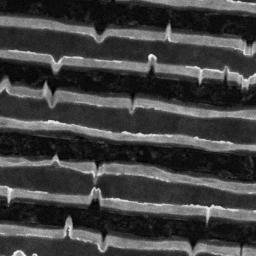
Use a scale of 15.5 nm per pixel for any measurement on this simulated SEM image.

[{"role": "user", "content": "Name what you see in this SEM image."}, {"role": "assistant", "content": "one or a few lines or trenches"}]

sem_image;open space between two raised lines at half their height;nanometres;549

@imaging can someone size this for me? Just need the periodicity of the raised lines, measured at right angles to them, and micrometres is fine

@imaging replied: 1.07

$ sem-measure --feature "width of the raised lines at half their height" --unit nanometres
522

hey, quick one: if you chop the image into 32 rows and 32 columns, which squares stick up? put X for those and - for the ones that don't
--------------------------XXXXXX
--------------------------------
--------------------------------
XXXXXXXXX-----------------------
XXXXXXXXXXXX-XXXXXXXXX----------
XXXXXXXXXXXXXXXXXXXXXXXXXXXXXX--
XXXXXXXXXXXXXXXXXXXXXXXXXXXXXXXX
------XXXXXXXXXXXXXXXXXXXXXXXXXX
--------------------XXXXXXXXXXXX
-----------------------------XXX
--------------------------------
XXXXXX--------------------------
XXXXXXXXXXXX--------------------
XXXXXXXXXXXXXXXXXXXXX-----------
XXXXXXXXXXXXXXXXXXXXXXXXXXXXXXXX
--XXXXXXXXXXXXXXXXXXXXXXXXXXXXXX
-----------XXXXXXXXXXXXXXXXXXXXX
-----------------------XXXXXXXXX
---------------------------XX---
--------------------------------
XXXXXXXX------------------------
XXXXXXXXXXXXXXXXXXX-------------
XXXXXXXXXXXXXXXXXXXXXXXXX-------
XXXXXXXXXXXXXXXXXXXXXXXXXXXXXXXX
-X---XXXXXXXXXXXXXXXXXXXXXXXXXXX
--------------XXXXXXXXXXXXXXXXXX
-------------------------XXXXXXX
--------------------------------
X-------X-----------------------
XXXXXXXXXXX---------------------
XXXXXXXXXXXXXXXXX---------------
XXXXXXXXXXXXXXXXXXXXXXXXXXXXXX--